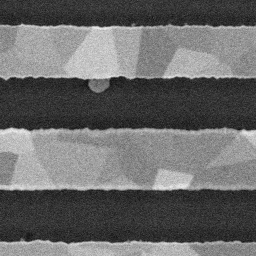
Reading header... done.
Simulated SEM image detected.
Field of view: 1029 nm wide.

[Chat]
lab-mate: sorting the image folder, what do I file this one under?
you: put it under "lines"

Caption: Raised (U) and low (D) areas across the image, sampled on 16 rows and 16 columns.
DDDDDDDDDDDDDDDD
DDDDDDDDDDDDDDDD
UUUUUUUUUUUUUUUU
UUUUUUUUUUUUUUUU
UUUUUUUUUUUUUUUU
DDDDDDDDDDDDDDDD
DDDDDDDDDDDDDDDD
DDDDDDDDDDDDDDDD
UUUUUUUUUUUUUUUU
UUUUUUUUUUUUUUUU
UUUUUUUUUUUUUUUU
UUUUUUUUUUUUUUUU
DDDDDDDDDDDDDDDD
DDDDDDDDDDDDDDDD
DDDDDDDDDDDDDDDD
UUUUUUUUUUUUUUUU